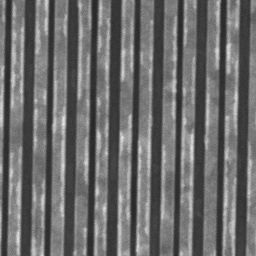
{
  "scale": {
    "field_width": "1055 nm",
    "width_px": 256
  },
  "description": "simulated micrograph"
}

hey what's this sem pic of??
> parallel lines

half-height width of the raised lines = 52 nm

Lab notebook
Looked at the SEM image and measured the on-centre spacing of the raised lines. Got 21.5 px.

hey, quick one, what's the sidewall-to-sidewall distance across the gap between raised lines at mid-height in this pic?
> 39.4 nm